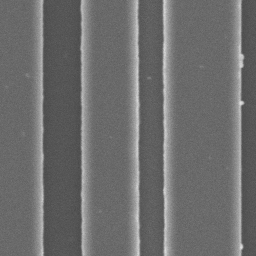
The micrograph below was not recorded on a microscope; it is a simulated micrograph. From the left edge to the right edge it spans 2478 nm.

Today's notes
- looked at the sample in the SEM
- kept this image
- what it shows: lines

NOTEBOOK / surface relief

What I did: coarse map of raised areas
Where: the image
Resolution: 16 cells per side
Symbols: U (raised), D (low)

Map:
UUUDDUUUUUUUUUUD
UUUDDUUUUUUUUUUD
UUUDDUUUUUUUUUUD
UUUDDUUUUUUUUUUD
UUUDDUUUUUUUUUUD
UUUDDUUUUUUUUUUD
UUUDDUUUUUUUUUUD
UUUDDUUUUUUUUUUD
UUUDDUUUUUUUUUUD
UUUDDUUUUUUUUUUD
UUUDDUUUUUUUUUUD
UUUDDUUUUUUUUUUD
UUUDDUUUUUUUUUUD
UUUDDUUUUUUUUUUD
UUUDDUUUUUUUUUUD
UUUDDUUUUUUUUUUD